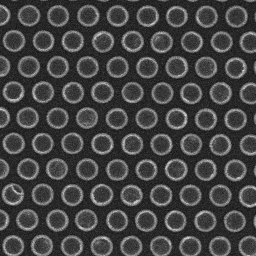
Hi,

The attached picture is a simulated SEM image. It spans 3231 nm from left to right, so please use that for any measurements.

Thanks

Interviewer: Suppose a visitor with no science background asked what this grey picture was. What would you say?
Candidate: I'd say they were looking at a regular array of raised bodies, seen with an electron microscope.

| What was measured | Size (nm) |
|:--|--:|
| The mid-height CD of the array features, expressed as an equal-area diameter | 257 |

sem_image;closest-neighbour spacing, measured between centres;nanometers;367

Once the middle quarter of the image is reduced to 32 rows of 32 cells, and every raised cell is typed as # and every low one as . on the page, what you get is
#...####...#####..#####...#####.
#...####...#####..#####...#####.
....####....###....####...####..
................................
................................
####....####...####....###....##
#####..#####...#####..#####..###
#####..#####...#####..#####..###
####...#####...####....####...##
..#....................###.....#
................................
....###.....##.....###.....##...
#...####...####...#####...#####.
#..#####...#####..#####...#####.
#..#####...#####..#####...#####.
.....##.....###....###....####..
................................
.##.............................
####....####...####...####....##
#####..#####...####...#####..###
#####..#####...####...#####..###
####....####...####...#####...##
...............................#
................................
....###.....###....###....####..
#..#####...#####..#####...####..
#..#####...#####..#####..######.
....####...#####...####...####..
.....##.....###....###.....###..
................................
.##.....###.....##..............
####...#####...####...####....##